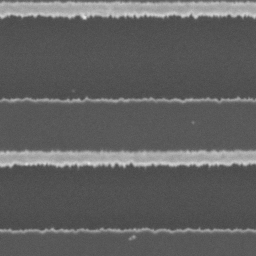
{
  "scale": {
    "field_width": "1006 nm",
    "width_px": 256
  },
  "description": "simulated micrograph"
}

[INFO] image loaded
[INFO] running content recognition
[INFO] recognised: lines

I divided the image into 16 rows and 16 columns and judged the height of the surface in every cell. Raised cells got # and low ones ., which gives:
################
................
................
................
................
................
################
################
################
################
................
................
................
................
################
################